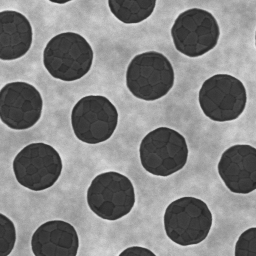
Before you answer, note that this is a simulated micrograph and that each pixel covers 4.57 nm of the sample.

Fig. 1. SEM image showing a regular array of holes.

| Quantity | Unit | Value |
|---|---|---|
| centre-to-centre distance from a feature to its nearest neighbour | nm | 312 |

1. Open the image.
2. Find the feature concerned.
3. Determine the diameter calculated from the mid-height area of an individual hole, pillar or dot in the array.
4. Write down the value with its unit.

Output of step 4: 218 nm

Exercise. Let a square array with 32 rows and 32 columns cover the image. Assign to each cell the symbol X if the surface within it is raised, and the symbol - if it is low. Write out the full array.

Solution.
XXXXXXXXXXXXXX-----XXXXXXXXXXXXX
--XXXXXXXXXXXX-----XXXX---XXXXXX
---XXXXXXXXXXXX---XXXX-----XXXXX
----XXXXXXXXXXXXXXXXXX-----XXXXX
----XXX---XXXXXXXXXXXX-----XXXXX
----XX-----XXXXXXXXXXX-----XXXXX
---XX-------XXXXXXXXXXX---XXXXXX
XXXXX-------XXXXX----XXXXXXXXXXX
XXXXXX-----XXXXX------XXXXXXXXXX
XXXXXXX---XXXXXX------XXXXX--XXX
X--XXXXXXXXXXXXX------XXX-----XX
-----XXXXXXXXXXX-----XXXX------X
-----XXXXX----XXXX-XXXXXX------X
-----XXXX-----XXXXXXXXXXX------X
-----XXXX------XXXXXXXXXXX----XX
X---XXXXX------XXXXXXXXXXXXXXXXX
XXXXXXXXX-----XXXXX---XXXXXXXXXX
XXXXXXXXXX---XXXXX-----XXXXXXXXX
XXX----XXXXXXXXXX------XXXXXX---
XX-----XXXXXXXXXXX-----XXXXX----
XX------XXXXXXXXXX-----XXXX-----
XX------XXXXXXXXXXX---XXXXX-----
XX-----XXXXX----XXXXXXXXXXXX----
XXX---XXXXX------XXXXXXXXXXXX---
XXXXXXXXXXX------XXXXXXXXXXXXXXX
XXXXXXXXXXX------XXXX-----XXXXXX
XXXXXXXXXXXX----XXXXX-----XXXXXX
-XXXXXXXXXXXXXXXXXXXX-----XXXXXX
--XXX----XXXXXXXXXXXX-----XXXXXX
--XX------XXXXXXXXXXX-----XXXX--
--XX------XXXXXXXXXXXX--XXXXXX--
-XXX------XXXXX----XXXXXXXXXX---